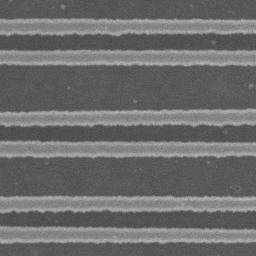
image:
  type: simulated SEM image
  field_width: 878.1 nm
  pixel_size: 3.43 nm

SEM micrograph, lines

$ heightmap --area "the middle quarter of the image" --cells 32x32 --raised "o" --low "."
................................
................................
................................
................................
................................
................................
................................
................................
................................
................................
................................
................................
oooooooooooooooooooooooooooooooo
oooooooooooooooooooooooooooooooo
oooooooooooooooooooooooooooooooo
......o.........................
................................
................................
................................
................................
oooooooooooooooooooooooooooooooo
oooooooooooooooooooooooooooooooo
oooooooooooooooooooooooooooooooo
................................
................................
................................
................................
................................
................................
................................
................................
................................